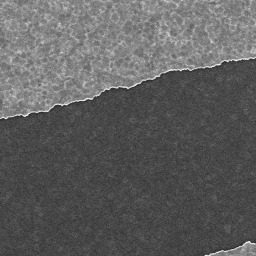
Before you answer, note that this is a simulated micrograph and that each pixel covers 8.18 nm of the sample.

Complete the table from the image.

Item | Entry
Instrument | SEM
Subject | one or a few lines or trenches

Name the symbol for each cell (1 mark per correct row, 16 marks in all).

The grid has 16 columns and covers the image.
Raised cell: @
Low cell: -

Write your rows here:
@@@@@@@@@@@@@@@@
@@@@@@@@@@@@@@@@
@@@@@@@@@@@@@@@@
@@@@@@@@@@@@@@@@
@@@@@@@@@@------
@@@@@@@---------
@@@@------------
----------------
----------------
----------------
----------------
----------------
----------------
----------------
----------------
---------------@